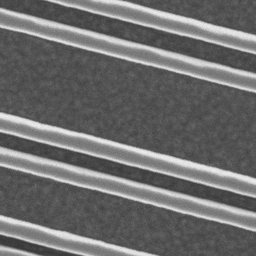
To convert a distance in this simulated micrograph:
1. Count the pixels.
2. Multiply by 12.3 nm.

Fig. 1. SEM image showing lines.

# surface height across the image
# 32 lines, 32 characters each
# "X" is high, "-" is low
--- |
-------XXXXXXXXX----------------
XX---------XXXXXXXXX------------
XXXXX----------XXXXXXXXX--------
-XXXXXXXX----------XXXXXXXXX----
----XXXXXXXXX----------XXXXXXXX-
--------XXXXXXXXX----------XXXXX
------------XXXXXXXXX----------X
----------------XXXXXXXXX-------
--------------------XXXXXXXXX---
------------------------XXXXXXXX
----------------------------XXXX
--------------------------------
--------------------------------
--------------------------------
X-------------------------------
XXXXX---------------------------
XXXXXXXXX-----------------------
----XXXXXXXXX-------------------
--------XXXXXXXXX---------------
XXXX--------XXXXXXXXX-----------
XXXXXXXX-------XXXXXXXXX--------
---XXXXXXXXX--------XXXXXXXX----
-------XXXXXXXXX--------XXXXXXXX
-----------XXXXXXXXX-------XXXXX
---------------XXXXXXXXX-------X
-------------------XXXXXXXX-----
----------------------XXXXXXXXX-
XX-------------------------XXXXX
XXXXX-------------------------XX
-XXXXXXXX-----------------------
-----XXXXXXXXX------------------
XXX-----XXXXXXXXX---------------